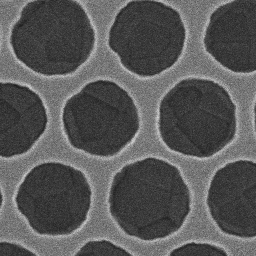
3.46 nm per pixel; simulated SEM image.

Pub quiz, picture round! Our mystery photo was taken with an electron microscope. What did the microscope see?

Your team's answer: holes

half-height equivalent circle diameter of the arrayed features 265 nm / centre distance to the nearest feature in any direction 0.322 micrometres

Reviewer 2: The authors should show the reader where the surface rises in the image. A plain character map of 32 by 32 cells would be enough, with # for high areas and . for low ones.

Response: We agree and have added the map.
###.......######....########....
###........####.......#####.....
##.........###.........###......
##.........###.........###......
#...........##.........###......
#...........##.........###......
##.........###.........###......
##.........####.......#####.....
####......######.....#######....
################################
..#########....#######.....#####
....######......#####.......####
.....####.......####.........###
......##.........###.........###
......##.........###.........###
......##.........###..........##
.....###.........###.........###
.....####.......####.........###
....######.....######.......####
..###########.##########..######
#####...########.....########...
####......#####.......#####.....
###........###.........####.....
##.........###..........##......
##.........###..........##......
##.........###..........##......
###........###..........##......
####.......####........####.....
####......#####.......#####.....
#################....#########..
..#########...#########...######
....######......#####.......####